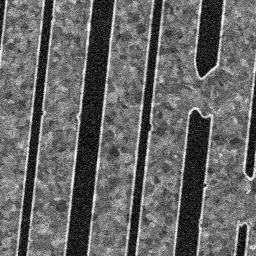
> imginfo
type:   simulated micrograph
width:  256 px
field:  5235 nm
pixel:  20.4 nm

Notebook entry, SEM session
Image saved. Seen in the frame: parallel lines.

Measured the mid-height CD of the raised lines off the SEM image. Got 0.75 µm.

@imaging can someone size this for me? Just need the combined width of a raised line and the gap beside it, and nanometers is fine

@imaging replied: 1120